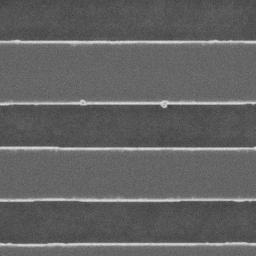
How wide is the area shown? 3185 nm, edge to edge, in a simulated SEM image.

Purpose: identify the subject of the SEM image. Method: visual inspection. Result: lines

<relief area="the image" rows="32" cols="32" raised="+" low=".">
................................
................................
................................
................................
................................
++++++++++++++++++++++++++++++++
++++++++++++++++++++++++++++++++
++++++++++++++++++++++++++++++++
++++++++++++++++++++++++++++++++
++++++++++++++++++++++++++++++++
++++++++++++++++++++++++++++++++
++++++++++++++++++++++++++++++++
++++++++++++++++++++++++++++++++
................................
................................
................................
................................
................................
+++++++........................+
++++++++++++++++++++++++++++++++
++++++++++++++++++++++++++++++++
++++++++++++++++++++++++++++++++
++++++++++++++++++++++++++++++++
++++++++++++++++++++++++++++++++
++++++++++++++++++++++++++++++++
................................
................................
................................
................................
................................
+.....++.+++++++++++++++++++++++
++++++++++++++++++++++++++++++++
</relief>